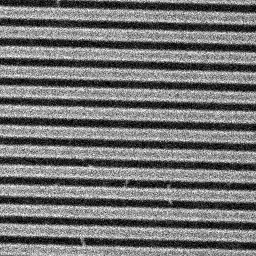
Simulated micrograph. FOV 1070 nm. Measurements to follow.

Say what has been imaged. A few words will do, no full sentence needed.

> parallel lines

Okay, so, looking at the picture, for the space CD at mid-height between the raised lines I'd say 0.0397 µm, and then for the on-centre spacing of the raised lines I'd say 82.6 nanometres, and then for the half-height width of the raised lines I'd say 43.3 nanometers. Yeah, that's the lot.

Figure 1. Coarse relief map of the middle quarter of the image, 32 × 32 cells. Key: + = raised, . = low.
................................
++++++++++++++++++++............
++++++++++++++++++++++++++++++++
++++++++++++++++++++++++++++++++
................................
................................
+++++++++++++++++++++...........
++++++++++++++++++++++++++++++++
++++..++++++++++++++++++++++++++
................................
................................
+++++++++++++++++++++++.........
++++++++++++++++++++++++++++++++
.........+++++++++++++++++++++++
................................
................................
+++++++++++++++++.....++........
++++++++++++++++++++++++++++++++
...........+++++++++++++++++++++
................................
................................
++++++++++++++++++++++++++......
++++++++++++++++++++++++++++++++
....+.......++++++++++++++++++++
................................
................................
++++++++++++++++++++++++++++....
++++++++++++++++++++++++++++++++
..............++++++++++++++++++
................................
................................
+++++++++++++++++++++++++++++...